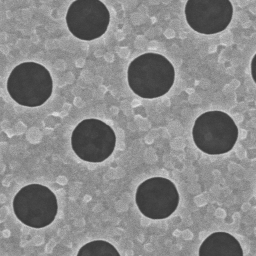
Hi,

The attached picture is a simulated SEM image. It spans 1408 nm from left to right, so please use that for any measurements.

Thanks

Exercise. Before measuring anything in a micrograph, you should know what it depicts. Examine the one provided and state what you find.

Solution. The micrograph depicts holes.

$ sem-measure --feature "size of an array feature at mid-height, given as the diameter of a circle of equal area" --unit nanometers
247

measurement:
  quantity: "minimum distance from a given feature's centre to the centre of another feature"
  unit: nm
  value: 473